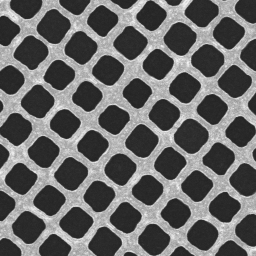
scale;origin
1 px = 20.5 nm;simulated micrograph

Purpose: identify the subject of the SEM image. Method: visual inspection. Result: a regular array of holes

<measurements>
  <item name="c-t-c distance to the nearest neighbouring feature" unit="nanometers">704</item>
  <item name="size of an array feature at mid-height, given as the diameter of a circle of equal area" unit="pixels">29.7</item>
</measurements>